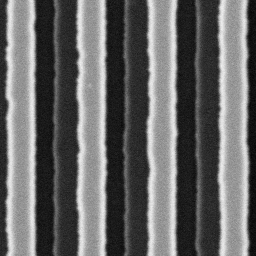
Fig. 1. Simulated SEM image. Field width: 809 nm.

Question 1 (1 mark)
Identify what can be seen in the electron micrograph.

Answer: lines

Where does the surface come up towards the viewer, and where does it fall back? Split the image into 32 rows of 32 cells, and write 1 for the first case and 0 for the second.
01110000001110000011110000001110
01110000001110000001110000011110
01110000001110000001110000011110
01110000001110000001110000011110
01110000001110000001110000011110
01110000001110000001110000011110
01110000001110000001110000001110
01110000001110000001110000001110
01110000001110000001110000001110
01110000001110000001110000001110
01110000001110000001110000001110
01110000001110000001110000011110
01110000001110000001110000001110
01110000001110000001110000001110
01110000001110000001110000011110
01110000001110000011110000011110
01110000001110000011110000001110
01110000001110000011110000001110
01110000001110000011110000001110
01110000001110000011110000001110
01110000001110000001110000011110
01110000001110000001110000011110
01110000001110000001110000011110
01110000001110000001110000011110
01110000001110000001110000001110
01110000001110000001110000001110
01110000001110000001110000001110
01110000001110000001110000001110
01110000001110000001110000001110
01110000001110000001110000001110
01110000001110000001110000001110
01110000001110000001110000001110